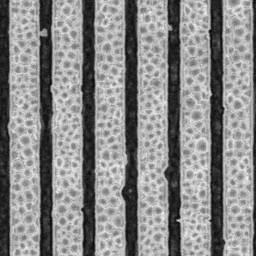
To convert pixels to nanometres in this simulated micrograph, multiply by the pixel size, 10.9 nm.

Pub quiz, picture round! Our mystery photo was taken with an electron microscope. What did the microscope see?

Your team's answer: parallel lines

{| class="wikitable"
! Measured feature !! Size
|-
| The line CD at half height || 316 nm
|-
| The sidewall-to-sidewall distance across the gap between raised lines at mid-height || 13.7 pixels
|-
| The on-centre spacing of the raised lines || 0.464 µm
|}